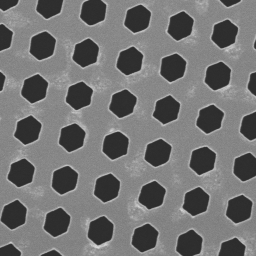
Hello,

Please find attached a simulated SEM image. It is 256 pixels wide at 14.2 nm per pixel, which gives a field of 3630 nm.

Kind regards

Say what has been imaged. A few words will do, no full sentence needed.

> a regular array of holes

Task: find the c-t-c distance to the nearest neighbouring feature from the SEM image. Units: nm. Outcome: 606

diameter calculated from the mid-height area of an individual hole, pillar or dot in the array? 0.374 um